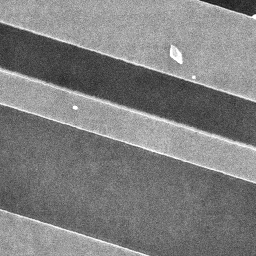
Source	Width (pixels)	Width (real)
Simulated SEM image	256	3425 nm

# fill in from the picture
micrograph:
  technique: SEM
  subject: lines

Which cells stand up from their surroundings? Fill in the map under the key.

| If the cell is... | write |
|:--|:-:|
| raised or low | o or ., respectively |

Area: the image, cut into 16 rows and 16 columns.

oooooooooooooo..
.ooooooooooooooo
....oooooooooooo
.......ooooooooo
..........oooooo
oooo.........ooo
ooooooo.........
...ooooooo......
......ooooooo...
..........oooooo
.............ooo
................
................
o...............
ooooo...........
oooooooo........